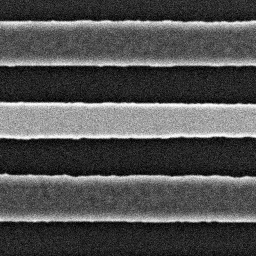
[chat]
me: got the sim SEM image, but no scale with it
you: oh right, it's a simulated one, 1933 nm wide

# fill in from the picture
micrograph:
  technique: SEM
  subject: lines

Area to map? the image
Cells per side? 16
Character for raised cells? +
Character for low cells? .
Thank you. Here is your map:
................
++++++++++++++++
++++++++++++++++
++++++++++++++++
................
................
++++++++.+......
++++++++++++++++
++++++++++++++++
................
................
++++++++++++++++
++++++++++++++++
++++++++++++++++
................
................